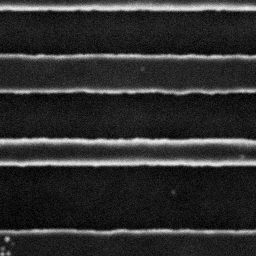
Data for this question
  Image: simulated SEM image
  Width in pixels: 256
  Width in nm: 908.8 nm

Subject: lines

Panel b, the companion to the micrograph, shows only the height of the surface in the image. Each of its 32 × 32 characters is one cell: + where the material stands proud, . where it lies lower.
++++++++++++++++++++++++++++++++
................................
................................
................................
................................
................................
................................
++++++++++++++++++++++++++++++++
++++++++++++++++++++++++++++++++
++++++++++++++++++++++++++++++++
++++++++++++++++++++++++++++++++
..++..+.....++++....++++.++++...
................................
................................
................................
................................
................................
..++++.+++.......+..............
++++++++++++++++++++++++++++++++
++++++++++++++++++++++++++++++++
++++++++++++++++++++++++++++++++
................................
................................
................................
................................
................................
................................
................................
................................
++++++++++++++++++++++++++++++++
++++++++++++++++++++++++++++++++
++++++++++++++++++++++++++++++++